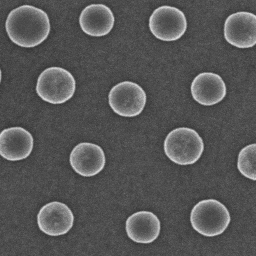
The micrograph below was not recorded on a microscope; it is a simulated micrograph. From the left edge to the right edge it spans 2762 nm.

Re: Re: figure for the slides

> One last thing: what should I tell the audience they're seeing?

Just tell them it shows a regular array of raised bodies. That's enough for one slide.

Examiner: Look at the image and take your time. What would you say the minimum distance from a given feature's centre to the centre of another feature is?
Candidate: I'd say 727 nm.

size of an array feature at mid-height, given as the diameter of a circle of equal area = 379 nanometers